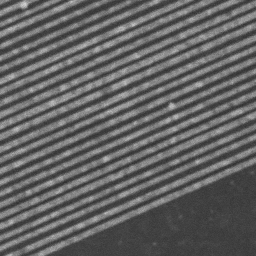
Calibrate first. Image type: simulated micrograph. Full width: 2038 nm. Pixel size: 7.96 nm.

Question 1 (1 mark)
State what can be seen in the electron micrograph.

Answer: parallel lines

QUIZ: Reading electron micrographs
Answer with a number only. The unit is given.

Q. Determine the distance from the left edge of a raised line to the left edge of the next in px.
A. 10.3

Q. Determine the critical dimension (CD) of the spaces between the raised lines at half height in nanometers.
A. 46.5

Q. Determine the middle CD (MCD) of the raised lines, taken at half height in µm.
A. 0.0338